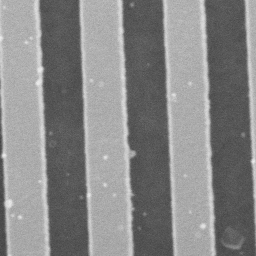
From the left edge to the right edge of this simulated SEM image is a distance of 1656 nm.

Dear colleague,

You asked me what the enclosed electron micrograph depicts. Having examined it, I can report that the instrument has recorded lines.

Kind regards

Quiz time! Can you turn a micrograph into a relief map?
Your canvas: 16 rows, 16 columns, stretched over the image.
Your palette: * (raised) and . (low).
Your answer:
**...***..***..*
**...***..***..*
***..***..***..*
***..***..***...
***..***..***...
***..***..***...
***..***..***...
***..***...**...
***..***...**...
***..***...**...
***..***...**...
***..***...**...
***..***...**...
***...**...**...
***...**...**...
***...**...**...